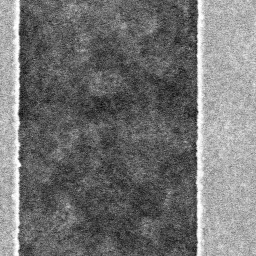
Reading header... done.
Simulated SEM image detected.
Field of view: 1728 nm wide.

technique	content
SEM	one or a few lines or trenches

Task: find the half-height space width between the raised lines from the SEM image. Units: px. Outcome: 181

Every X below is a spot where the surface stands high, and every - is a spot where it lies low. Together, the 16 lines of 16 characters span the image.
X-----------XXXX
X-----------XXXX
X-----------XXXX
X-----------XXXX
X-----------XXXX
X-----------XXXX
X-----------XXXX
X-----------XXXX
X-----------XXXX
X-----------XXXX
X-----------XXXX
X-----------XXXX
X-----------XXXX
X-----------XXXX
X-----------XXXX
X-----------XXXX